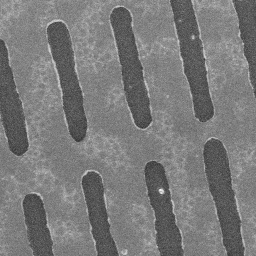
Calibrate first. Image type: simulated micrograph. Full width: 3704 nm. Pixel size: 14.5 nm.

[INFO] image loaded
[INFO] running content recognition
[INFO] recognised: holes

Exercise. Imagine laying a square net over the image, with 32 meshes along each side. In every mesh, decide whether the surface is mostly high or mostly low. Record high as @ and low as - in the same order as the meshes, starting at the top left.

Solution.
@@@@@@@@@@@@@@@@@@@@@---@@@@@---
@@@@@@@@@@@@@@--@@@@@@--@@@@@---
@@@@@@@@@@@@@@---@@@@@---@@@@@--
@@@@@@--@@@@@@---@@@@@---@@@@@--
@@@@@@---@@@@@---@@@@@---@@@@@--
-@@@@@---@@@@@---@@@@@---@@@@@--
-@@@@@---@@@@@@--@@@@@----@@@@--
-@@@@@@--@@@@@@---@@@@@---@@@@@-
-@@@@@@---@@@@@---@@@@@---@@@@@-
--@@@@@---@@@@@---@@@@@---@@@@@-
--@@@@@---@@@@@---@@@@@@--@@@@@-
--@@@@@@--@@@@@@---@@@@@--@@@@@@
---@@@@@--@@@@@@---@@@@@--@@@@@@
---@@@@@--@@@@@@---@@@@@---@@@@@
---@@@@@---@@@@@---@@@@@---@@@@@
---@@@@@---@@@@@@--@@@@@@@@@@@@@
@--@@@@@@--@@@@@@@@@@@@@@@@@@@@@
@---@@@@@-@@@@@@@@@@@@@@@@-@@@@@
@---@@@@@@@@@@@@@@@@@@@@@---@@@@
@@@@@@@@@@@@@@@@@@@@@@@@@---@@@@
@@@@@@@@@@@@@@@@@@--@@@@@@---@@@
@@@@@@@@@@@-@@@@@@---@@@@@---@@@
@@@@@@@@@@---@@@@@---@@@@@---@@@
@@@@@@@@@@---@@@@@---@@@@@---@@@
@@@--@@@@@---@@@@@@--@@@@@---@@@
@@@--@@@@@@--@@@@@@---@@@@@---@@
@@@---@@@@@--@@@@@@---@@@@@---@@
@@@---@@@@@---@@@@@---@@@@@---@@
@@@---@@@@@---@@@@@---@@@@@@--@@
@@@---@@@@@@--@@@@@----@@@@@--@@
@@@@---@@@@@--@@@@@@---@@@@@---@
@@@@---@@@@@---@@@@@---@@@@@---@